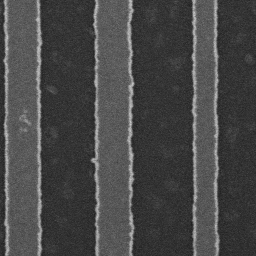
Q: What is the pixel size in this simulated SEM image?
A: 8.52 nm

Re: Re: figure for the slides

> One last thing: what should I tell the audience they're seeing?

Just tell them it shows one or a few lines or trenches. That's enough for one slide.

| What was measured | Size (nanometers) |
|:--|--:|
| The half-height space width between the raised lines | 505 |